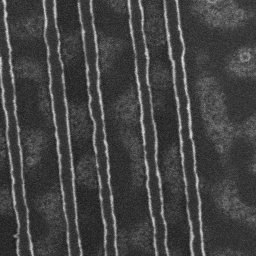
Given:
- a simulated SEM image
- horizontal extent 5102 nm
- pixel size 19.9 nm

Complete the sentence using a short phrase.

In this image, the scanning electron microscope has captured parallel lines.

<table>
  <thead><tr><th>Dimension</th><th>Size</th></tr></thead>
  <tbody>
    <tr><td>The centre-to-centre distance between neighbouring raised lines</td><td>0.843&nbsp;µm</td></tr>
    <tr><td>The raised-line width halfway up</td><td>243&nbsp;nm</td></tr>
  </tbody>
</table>